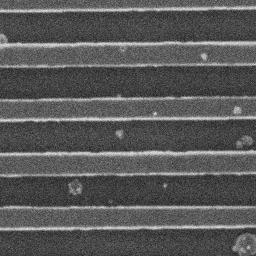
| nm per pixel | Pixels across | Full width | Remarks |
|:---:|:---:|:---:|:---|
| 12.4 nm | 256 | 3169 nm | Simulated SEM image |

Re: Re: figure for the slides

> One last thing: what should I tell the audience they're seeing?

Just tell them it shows lines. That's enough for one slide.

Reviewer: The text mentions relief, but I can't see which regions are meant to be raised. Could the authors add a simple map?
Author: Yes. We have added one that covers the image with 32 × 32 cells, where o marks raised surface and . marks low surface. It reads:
oooooooooooooooooooooooooooooooo
................................
................................
................................
................................
..........oooooooooooooooooooooo
oooooooooooooooooooooooooooooooo
oooooooooooooooooooooooooooooooo
................................
................................
................................
................................
.....ooooooooooooooooooooooooooo
oooooooooooooooooooooooooooooooo
oooooooooooooooooooooooooooooooo
................................
................................
................................
................................
oooooooooooooooooooooooooooooooo
oooooooooooooooooooooooooooooooo
oooooooooooooooooooooooooooooooo
................................
................................
................................
................................
oooooooooooooooooooooooooooooooo
oooooooooooooooooooooooooooooooo
ooooooooooooooooo...............
................................
................................
................................